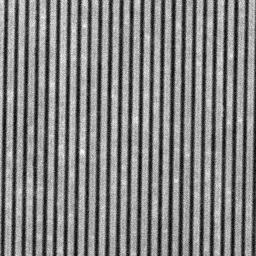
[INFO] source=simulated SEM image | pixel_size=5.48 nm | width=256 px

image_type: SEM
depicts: parallel lines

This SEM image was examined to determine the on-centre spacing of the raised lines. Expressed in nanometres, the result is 57.3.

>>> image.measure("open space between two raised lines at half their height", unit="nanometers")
28.8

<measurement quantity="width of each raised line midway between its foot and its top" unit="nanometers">29.5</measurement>